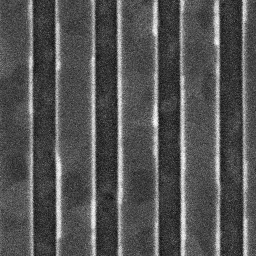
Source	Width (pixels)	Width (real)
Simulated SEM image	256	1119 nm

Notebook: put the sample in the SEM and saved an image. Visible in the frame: one or a few lines or trenches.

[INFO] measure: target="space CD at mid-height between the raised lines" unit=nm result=103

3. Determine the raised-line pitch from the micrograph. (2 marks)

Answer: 62.3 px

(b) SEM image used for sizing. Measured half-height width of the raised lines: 170 nm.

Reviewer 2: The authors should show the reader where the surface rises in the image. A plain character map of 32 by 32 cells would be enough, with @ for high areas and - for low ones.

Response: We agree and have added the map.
@@@@---@@@@@---@@@@@---@@@@---@@
@@@@---@@@@@---@@@@@---@@@@---@@
@@@@---@@@@@---@@@@@---@@@@---@@
@@@@---@@@@@---@@@@@---@@@@---@@
@@@@---@@@@@---@@@@@---@@@@---@@
@@@@---@@@@@---@@@@@---@@@@---@@
@@@@---@@@@@---@@@@@---@@@@---@@
@@@@---@@@@@---@@@@@---@@@@---@@
@@@@---@@@@@---@@@@@---@@@@---@@
@@@@---@@@@@---@@@@@---@@@@---@@
@@@@---@@@@@---@@@@@---@@@@---@@
@@@@---@@@@@---@@@@@---@@@@---@@
@@@@---@@@@@---@@@@@---@@@@---@@
@@@@---@@@@@---@@@@@---@@@@---@@
@@@@---@@@@@---@@@@@---@@@@---@@
@@@@---@@@@@---@@@@@---@@@@---@@
@@@@---@@@@@---@@@@@---@@@@----@
@@@@---@@@@@---@@@@@---@@@@----@
@@@@---@@@@@---@@@@@---@@@@----@
@@@@---@@@@@---@@@@@---@@@@----@
@@@@---@@@@@---@@@@@---@@@@----@
@@@@---@@@@@---@@@@@---@@@@----@
@@@@---@@@@@---@@@@@---@@@@----@
@@@@---@@@@@---@@@@@---@@@@----@
@@@@---@@@@@---@@@@@---@@@@----@
@@@@---@@@@@---@@@@@---@@@@----@
@@@@---@@@@@---@@@@@---@@@@----@
@@@@---@@@@@---@@@@@---@@@@---@@
@@@@---@@@@@---@@@@@---@@@@---@@
@@@@---@@@@@---@@@@@---@@@@---@@
@@@@---@@@@@---@@@@@---@@@@----@
@@@@---@@@@@---@@@@@---@@@@----@